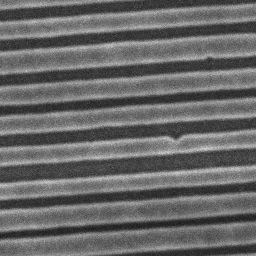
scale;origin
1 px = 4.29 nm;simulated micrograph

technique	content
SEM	parallel lines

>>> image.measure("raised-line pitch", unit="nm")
135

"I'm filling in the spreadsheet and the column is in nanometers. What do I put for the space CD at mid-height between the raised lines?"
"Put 58.8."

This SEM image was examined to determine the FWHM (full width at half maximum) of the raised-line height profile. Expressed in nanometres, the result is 73.8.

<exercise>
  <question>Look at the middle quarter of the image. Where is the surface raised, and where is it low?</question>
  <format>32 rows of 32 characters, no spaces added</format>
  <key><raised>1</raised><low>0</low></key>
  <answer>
11111111110000000000000000000000
00000000000000000000000000000000
00000000000000000000000000000011
00000000000000000001111111111111
00111111111111111111111111111111
11111111111111111111111111111111
11111111111111111111111111111111
11111111111111111111111000000000
11111110000000000000000000000000
00000000000000000000000000000000
00000000000000000000110111111111
00000000001111111111111111111111
11111111111111111111111111111111
11111111111111111111111111111111
11111111111111111111111110000000
11111111100000000000000000000000
00000000000000000000000000000000
00000000000000000000000000000000
00000000000000000000000111000111
00000000000011111111111111111111
11111111111111111111111111111111
11111111111111111111111111111111
11111111111111111111110100000000
11111111111000000000000000000000
00000000000000000000000000000000
00000000000000000000000000000000
00000000000000000000000000000000
00000000000000000000000111111111
00000000001111111111111111111111
11111111111111111111111111111111
11111111111111111111111111100000
11111111111110100000000000000000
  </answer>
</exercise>